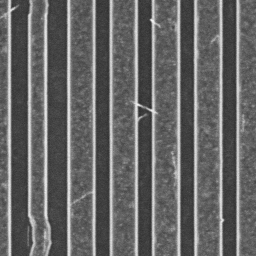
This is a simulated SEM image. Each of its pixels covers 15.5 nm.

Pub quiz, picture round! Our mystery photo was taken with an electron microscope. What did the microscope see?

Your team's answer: parallel lines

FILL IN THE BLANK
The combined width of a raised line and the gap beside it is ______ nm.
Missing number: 658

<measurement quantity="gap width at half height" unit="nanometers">244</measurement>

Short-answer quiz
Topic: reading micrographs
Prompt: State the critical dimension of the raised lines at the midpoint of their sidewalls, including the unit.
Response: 0.416 µm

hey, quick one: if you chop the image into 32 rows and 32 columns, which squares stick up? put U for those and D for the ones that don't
UDDDUUDDDUUUDDUUUDDUUUDDUUUUDDUU
UDDDUUDDDUUUDDUUUDDUUUDDUUUUDDUU
UDDDUUDDDUUUDDUUUDDUUUDDUUUUDDUU
UDDDUUDDDUUUDDUUUDDUUUDDUUUUDDUU
UDDDUUDDDUUUDDUUUDDUUUDDUUUUDDUU
UDDDUUDDDUUUDDUUUDDUUUDDUUUUDDUU
UDDDUUDDDUUUDDUUUDDUUUDDUUUUDDUU
UDDDUUDDDUUUDDUUUDDUUUDDUUUUDDUU
UDDDUUDDDUUUDDUUUDDUUUDDUUUUDDUU
UDDDUUDDDUUUDDUUUDDUUUDDUUUUDDUU
UDDDUUDDDUUUDDUUUDDUUUDDUUUUDDUU
UDDDUUDDDUUUDDUUUDDUUUDDUUUUDDUU
UDDDUUDDDUUUDDUUUDDUUUDDUUUUDDUU
UDDDUUDDDUUUDDUUUDDUUUDDUUUUDDUU
UDDDUUDDDUUUDDUUUDDUUUDDUUUUDDUU
UDDDUUDDDUUUDDUUUDDUUUDDUUUUDDUU
UDDDUUDDDUUUDDUUUDDUUUDDUUUUDDUU
UDDDUUDDDUUUDDUUUDDUUUDDUUUUDDUU
UDDDUUDDDUUUDDUUUDDUUUDDUUUUDDUU
UDDDUUDDDUUUDDUUUDDUUUDDUUUUDDUU
UDDDUUDDDUUUDDUUUDDUUUDDUUUUDDUU
UDDDUUDDDUUUDDUUUDDUUUDDUUUUDDUU
UDDDUUDDDUUUDDUUUDDUUUDDUUUUDDUU
UDDDUUDDDUUUDDUUUDDUUUDDUUUUDDUU
UDDDUUDDDUUUDDUUUDDUUUDDUUUUDDUU
UDDDUUDDDUUUDDUUUDDUUUDDUUUUDDUU
UDDDUUDDDUUUDDUUUDDUUUDDUUUUDDUU
UDDDUUDDDUUUDDUUUDDUUUDDUUUUDDUU
UDDDUUDDDUUUDDUUUDDUUUDDUUUUDDUU
UDDDUUDDDUUUDDUUUDDUUUDDUUUUDDUU
UDDDUUDDDUUUDDUUUDDUUUDDUUUUDDUU
UDDDUUDDDUUUDDUUUDDUUUDDUUUUDDUU